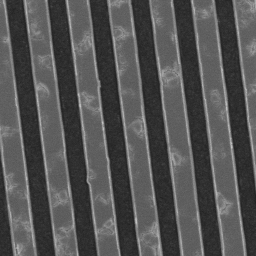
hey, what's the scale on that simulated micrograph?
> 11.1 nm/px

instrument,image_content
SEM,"parallel lines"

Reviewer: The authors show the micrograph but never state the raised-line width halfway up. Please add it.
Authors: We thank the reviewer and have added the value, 249 nanometres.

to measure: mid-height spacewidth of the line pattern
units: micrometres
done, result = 0.212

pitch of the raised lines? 461 nm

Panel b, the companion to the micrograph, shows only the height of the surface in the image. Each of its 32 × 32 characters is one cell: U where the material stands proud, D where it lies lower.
UDDUUUDDUUUDDDUUDDDUUUDDUUUDDUUU
UDDUUUDDDUUDDDUUDDDUUUDDUUUDDUUU
UDDUUUDDDUUDDDUUUDDUUUDDUUUDDDUU
UDDUUUDDDUUDDDUUUDDUUUDDUUUDDDUU
UDDDUUDDDUUUDDUUUDDUUUDDDUUDDDUU
UDDDUUDDDUUUDDUUUDDUUUDDDUUDDDUU
UDDDUUUDDUUUDDUUUDDUUUDDDUUUDDUU
UDDDUUUDDUUUDDUUUDDDUUDDDUUUDDUU
UUDDUUUDDUUUDDDUUDDDUUUDDUUUDDUU
UUDDUUUDDDUUDDDUUDDDUUUDDUUUDDUU
UUDDUUUDDDUUDDDUUUDDUUUDDUUUDDUU
UUDDDUUDDDUUDDDUUUDDUUUDDUUUDDDU
UUDDDUUDDDUUUDDUUUDDUUUDDDUUDDDU
UUDDDUUDDDUUUDDUUUDDUUUDDDUUDDDU
UUDDDUUUDDUUUDDUUUDDDUUDDDUUDDDU
UUDDDUUUDDUUUDDDUUDDDUUDDDUUUDDU
UUUDDUUUDDUUUDDDUUDDDUUUDDUUUDDU
UUUDDUUUDDUUUDDDUUDDDUUUDDUUUDDU
UUUDDUUUDDDUUDDDUUDDDUUUDDUUUDDD
UUUDDDUUDDDUUDDDUUUDDUUUDDUUUDDD
UUUDDDUUDDDUUUDDUUUDDUUUDDUUUDDD
DUUDDDUUDDDUUUDDUUUDDUUUDDDUUDDD
DUUDDDUUUDDUUUDDUUUDDDUUDDDUUUDD
DUUDDDUUUDDUUUDDUUUDDDUUDDDUUUDD
DUUUDDUUUDDUUUDDDUUDDDUUDDDUUUDD
DUUUDDUUUDDUUUDDDUUDDDUUUDDUUUDD
DUUUDDUUUDDDUUDDDUUUDDUUUDDUUUDD
DUUUDDDUUDDDUUDDDUUUDDUUUDDUUUDD
DUUUDDDUUDDDUUUDDUUUDDUUUDDDUUDD
DDUUDDDUUDDDUUUDDUUUDDUUUDDDUUDD
DDUUDDDUUUDDUUUDDUUUDDDUUDDDUUUD
DDUUDDDUUUDDUUUDDUUUDDDUUDDDUUUD